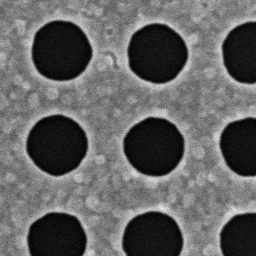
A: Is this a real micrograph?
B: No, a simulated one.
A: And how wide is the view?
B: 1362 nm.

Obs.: holes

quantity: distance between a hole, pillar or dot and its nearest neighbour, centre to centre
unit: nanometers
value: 497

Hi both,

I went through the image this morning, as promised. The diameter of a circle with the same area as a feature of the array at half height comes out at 325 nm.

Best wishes